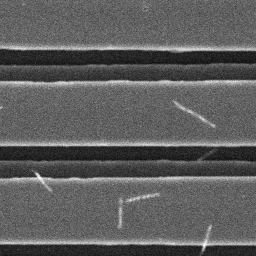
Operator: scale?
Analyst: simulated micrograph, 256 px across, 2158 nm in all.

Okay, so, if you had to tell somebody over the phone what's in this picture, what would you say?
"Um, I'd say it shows lines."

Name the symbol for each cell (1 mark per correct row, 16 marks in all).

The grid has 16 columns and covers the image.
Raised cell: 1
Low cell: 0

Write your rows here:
1111111111111111
1111111111111111
1111111111111111
0000000000000000
0000000000000000
1111111111111111
1111111111111111
1111111111111111
1111111111111111
0000000000000000
0000000000000000
1111111111111111
1111111111111111
1111111111111111
1111111111111111
0000000000000000